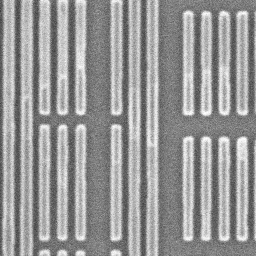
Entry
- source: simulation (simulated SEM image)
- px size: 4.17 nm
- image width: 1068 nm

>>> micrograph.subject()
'wiring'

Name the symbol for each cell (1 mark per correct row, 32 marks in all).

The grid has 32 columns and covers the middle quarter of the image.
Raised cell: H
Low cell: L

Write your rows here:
HLLHHLLLLLLLHHLLLHHLLHHLLLLLLLHH
HLLHHLLLLLLLHHLLLHHLLHHLLLLLLLHH
HLLHHLLLLLLLHHLLLHHLLHHLLLLLLLHH
HLLHHLLLLLLLHHLLLHHLLHHLLLLLLLHH
HLLHHLLLLLLLHHLLLHHLLHHLLLLLLLHH
HLLHHLLLLLLLHHLLLHHLLHHLLLLLLLHH
HLLHHLLLLLLLHHLLLHHLLHHLLLLLLLHH
HLLHHLLLLLLLHHLLLHHLLHHLLLLLLLHH
HLLHHLLLLLLLHHLLLHHLLHHLLLLLLLHH
HLLHHLLLLLLLHHLLLHHLLHHLLLLLLLHH
HLLHHLLLLLLLHHLLLHHLLHHLLLLLLLHH
HLLHHLLLLLLLHHLLLHHLLHHLLLLLLLHH
LLLLLLLLLLLLLLLLLHHLLHHLLLLLLLLL
LLLLLLLLLLLLLLLLLHHLLHHLLLLLLLLL
LLLLLLLLLLLLLLLLLHHLLHHLLLLLLLLL
LLLLHLLLLLLLHHLLLHHLLHHLLLLLLLLL
LLLHHLLLLLLLHHLLLHLLLHHLLLLLLLLL
LLLHHLLLLLLLHHLLLHHLLHHLLLLLLLLL
LLLHHLLLLLLLHHLLLHHLLLLLLLLLLLLH
LLLHHLLLLLLLHHLLLHHLLHLLLLLLLLHH
HLLHHLLLLLLLHHLLLHHLLHHLLLLLLLHH
HLLHHLLLLLLLHHLLLHHLLHHLLLLLLLHH
HLLHHLLLLLLLHHLLLHHLLHHLLLLLLLHH
HLLHHLLLLLLLHHLLLHHLLHHLLLLLLLHH
HLLHHLLLLLLLHHLLLHHLLHHLLLLLLLHH
LLLHHLLLLLLLHHLLLHHLLHHLLLLLLLHH
LLLHHLLLLLLLHHLLLHHLLHHLLLLLLLHH
LLLHHLLLLLLLHHLLLHHLLHHLLLLLLLHH
LLLHHLLLLLLLHHLLLHHLLHHLLLLLLLHH
LLLHHLLLLLLLHHLLLHHLLHHLLLLLLLHH
LLLHHLLLLLLLHHLLLHLLLHHLLLLLLLHH
LLLHHLLLLLLLHHLLLHLLLHHLLLLLLLHH